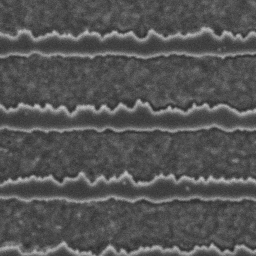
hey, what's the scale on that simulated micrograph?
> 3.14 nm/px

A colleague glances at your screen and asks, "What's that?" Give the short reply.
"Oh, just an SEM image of lines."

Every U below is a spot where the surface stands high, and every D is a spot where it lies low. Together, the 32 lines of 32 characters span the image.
DDDDDDDDDDDDDDDDDDDDDDDDDDDDDDDD
DDDDDDDDDDDDDDDDDDDDDDDDDDDDDDDD
DDDDDDDDDDDDDDDDDDDDDDDDDDDDDDDD
DDDDDDDDDDDDDDDDDDDDDDDDDDDDDDDD
UDUUDUUUUDUUUUUUUDUUDUUUUUUUUUDU
UUUUUUUUUUUUUUUUUUUUUUUUUUUUUUUU
UUUUUUUUUUUUUUUUUUUUUUUUUUUUUUUU
DDDDDDDDDDDDDDDDDDDDDDDDDDDDDDDD
DDDDDDDDDDDDDDDDDDDDDDDDDDDDDDDD
DDDDDDDDDDDDDDDDDDDDDDDDDDDDDDDD
DDDDDDDDDDDDDDDDDDDDDDDDDDDDDDDD
DDDDDDDDDDDDDDDDDDDDDDDDDDDDDDDD
DDDDDDDDDDDDDDDDDDDDDDDDDDDDDDDD
UDUUUUUUDDUUDDUUUUUDDUDDUUUUUDDD
UUUUUUUUUUUUUUUUUUUUUUUUUUUUUUUU
UUUUUUUUUUUUUUUUUUUUUUUUUUUUUUUU
DDDUDDDDDDDDDDDDDDDDDUDDDDDDDDDD
DDDDDDDDDDDDDDDDDDDDDDDDDDDDDDDD
DDDDDDDDDDDDDDDDDDDDDDDDDDDDDDDD
DDDDDDDDDDDDDDDDDDDDDDDDDDDDDDDD
DDDDDDDDDDDDDDDDDDDDDDDDDDDDDDDD
DDDDDDDDDDDDDDDDDDDDDDDDDDDDDDDD
DDUUUUUDUUUDUUUUUDDUUUUUUUUUUUUU
UUUUUUUUUUUUUUUUUUUUUUUUUUUUUUUU
UUUUUUUUUUUUUUUUUUUUUUUUUUUUUUUU
DDDDDDDDDDDDDDDDDDDDDDDDDDDDDDDD
DDDDDDDDDDDDDDDDDDDDDDDDDDDDDDDD
DDDDDDDDDDDDDDDDDDDDDDDDDDDDDDDD
DDDDDDDDDDDDDDDDDDDDDDDDDDDDDDDD
DDDDDDDDDDDDDDDDDDDDDDDDDDDDDDDD
DDDDDDDDDDDDDDDDDDDDDDDDDDDDDDDD
UUUDUUUUUUDDDUUUUUUUUUUUUUUUUUUU